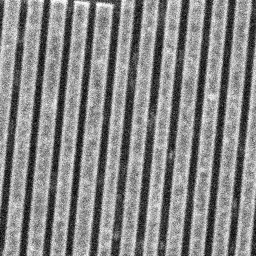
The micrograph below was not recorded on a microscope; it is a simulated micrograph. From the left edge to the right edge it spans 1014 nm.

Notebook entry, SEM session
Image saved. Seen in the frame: parallel lines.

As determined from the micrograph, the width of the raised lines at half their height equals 55.7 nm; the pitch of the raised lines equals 91.2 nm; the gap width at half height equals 34.5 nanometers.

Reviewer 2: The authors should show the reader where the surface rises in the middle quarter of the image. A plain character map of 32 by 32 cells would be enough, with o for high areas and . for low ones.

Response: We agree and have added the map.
.oooo..oooo..ooo...ooo..oooo..oo
.ooo...oooo..ooo..oooo..oooo..oo
.ooo...oooo..ooo..oooo..ooo...oo
.ooo...ooo...ooo..oooo..ooo...oo
.ooo...ooo...ooo..oooo..ooo...oo
.ooo..oooo...oo...ooo...ooo..ooo
.ooo..oooo...oo...ooo...ooo..ooo
.ooo..oooo..ooo...ooo...ooo..ooo
oooo..oooo..ooo...ooo...ooo..ooo
oooo..oooo..ooo...ooo...ooo..ooo
oooo..oooo..ooo...ooo...ooo..ooo
oooo..oooo..ooo...ooo..oooo..ooo
ooo...oooo..ooo..oooo..ooo...ooo
ooo...ooo...ooo..oooo..ooo...ooo
ooo...ooo...ooo..oooo..ooo...ooo
ooo..oooo...ooo..ooo...ooo...ooo
ooo..oooo...oo...ooo...ooo..oooo
ooo..oooo..ooo...ooo...ooo..oooo
ooo..oooo..ooo...ooo...ooo..oooo
ooo..oooo..ooo...ooo...ooo..oooo
ooo..oooo..ooo...ooo...ooo..oooo
ooo..oooo..ooo...ooo..oooo..oooo
oo...oooo..ooo..oooo..ooo...ooo.
oo...ooo...ooo..oooo..ooo...ooo.
oo...ooo...ooo..oooo..ooo...ooo.
oo...ooo...ooo..ooo...ooo...ooo.
oo..oooo...oo...ooo...ooo...ooo.
oo..oooo..ooo...ooo...ooo..oooo.
oo..oooo..ooo...ooo...ooo..oooo.
oo..oooo..ooo...ooo...ooo..oooo.
oo..oooo..ooo...ooo...ooo..oooo.
oo..oooo..ooo...ooo...ooo..oooo.